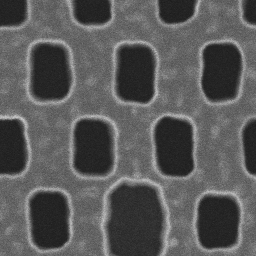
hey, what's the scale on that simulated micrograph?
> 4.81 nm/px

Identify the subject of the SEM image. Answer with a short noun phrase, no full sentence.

holes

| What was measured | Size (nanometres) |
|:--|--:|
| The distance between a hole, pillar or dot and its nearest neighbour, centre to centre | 406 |